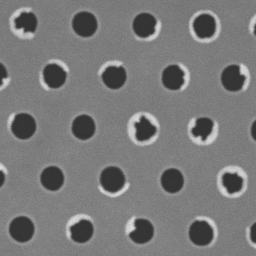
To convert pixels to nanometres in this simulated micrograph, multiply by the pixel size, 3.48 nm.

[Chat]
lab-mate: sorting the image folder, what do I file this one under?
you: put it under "a regular array of holes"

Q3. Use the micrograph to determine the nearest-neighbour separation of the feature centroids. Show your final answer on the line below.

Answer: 58.9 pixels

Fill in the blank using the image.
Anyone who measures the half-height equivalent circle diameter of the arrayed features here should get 81.7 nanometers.